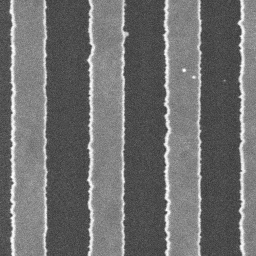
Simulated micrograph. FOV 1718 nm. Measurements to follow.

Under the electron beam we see lines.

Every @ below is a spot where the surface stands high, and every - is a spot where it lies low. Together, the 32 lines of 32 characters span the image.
-@@@@@-----@@@@@-----@@@@-----@@
-@@@@@-----@@@@@-----@@@@-----@@
-@@@@@-----@@@@@-----@@@@-----@@
-@@@@@-----@@@@------@@@@-----@@
-@@@@@-----@@@@@-----@@@@-----@@
-@@@@@-----@@@@@-----@@@@-----@@
-@@@@@-----@@@@@-----@@@@-----@@
-@@@@@-----@@@@@-----@@@@-----@@
-@@@@@-----@@@@@-----@@@@-----@@
-@@@@@-----@@@@------@@@@-----@@
-@@@@@-----@@@@@-----@@@@-----@@
--@@@@-----@@@@@-----@@@@-----@@
-@@@@@-----@@@@@-----@@@@-----@@
-@@@@@-----@@@@@-----@@@@-----@@
-@@@@@-----@@@@@-----@@@@-----@@
-@@@@@-----@@@@@-----@@@@-----@@
-@@@@@-----@@@@@-----@@@@-----@@
-@@@@@-----@@@@@-----@@@@-----@@
-@@@@@-----@@@@------@@@@-----@@
-@@@@@-----@@@@------@@@@-----@@
-@@@@@-----@@@@@-----@@@@-----@@
-@@@@@-----@@@@@-----@@@@-----@@
--@@@@-----@@@@@-----@@@@-----@@
-@@@@@-----@@@@@-----@@@@-----@@
-@@@@@-----@@@@------@@@@-----@@
-@@@@@-----@@@@@-----@@@@-----@@
-@@@@@-----@@@@@-----@@@@-----@@
-@@@@@-----@@@@------@@@@-----@@
--@@@@-----@@@@------@@@@-----@@
-@@@@@-----@@@@@-----@@@@-----@@
-@@@@@-----@@@@@-----@@@@-----@@
-@@@@@-----@@@@@-----@@@@-----@@